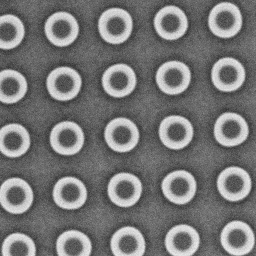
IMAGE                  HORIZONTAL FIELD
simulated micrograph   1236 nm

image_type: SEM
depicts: an array of small figures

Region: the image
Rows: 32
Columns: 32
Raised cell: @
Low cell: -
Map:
---------------------------@@---
-------------@@@----@@@---@@@@--
@@----@@@---@@@@---@@@@---@@@@--
@@@---@@@@--@@@@---@@@@---@@@@--
@@@---@@@@---@@@----@@@----@@---
@@-----@@-----------------------
--------------------------------
----------------------------@---
-------@@-----@@----@@@----@@@--
@@@---@@@@---@@@@---@@@@---@@@--
@@@---@@@@---@@@@---@@@@---@@@--
@@@---@@@@---@@@-----@@---------
@@------------------------------
--------------------------------
----------------------------@@--
-------@@-----@@@---@@@@---@@@@-
@@@----@@@---@@@@---@@@@---@@@@-
@@@@--@@@@---@@@@---@@@@---@@@--
@@@----@@@----@@-----@@---------
-@------------------------------
--------------------------------
----------------------@-----@@@-
-@@-----@@----@@@----@@@---@@@@-
@@@@---@@@@---@@@@--@@@@---@@@@-
@@@@---@@@@---@@@----@@@----@@@-
@@@@---@@@-----@@---------------
-@@-----------------------------
--------------------------------
----------------@-----@@----@@@-
-@@-----@@@---@@@@---@@@@---@@@@
@@@@---@@@@---@@@@---@@@@---@@@@
@@@@---@@@@---@@@@---@@@-----@@-